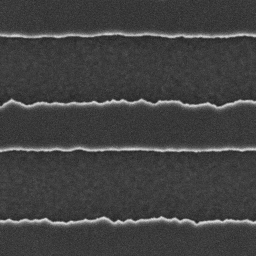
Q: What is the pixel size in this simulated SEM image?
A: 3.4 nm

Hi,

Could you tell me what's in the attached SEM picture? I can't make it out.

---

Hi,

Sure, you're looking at lines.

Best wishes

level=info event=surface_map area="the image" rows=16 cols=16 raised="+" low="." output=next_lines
++++++++++++++++
++++++++++++++++
................
................
................
................
+.++++++++++..++
++++++++++++++++
++++++++++++++++
................
................
................
................
................
++++++++++++++++
++++++++++++++++